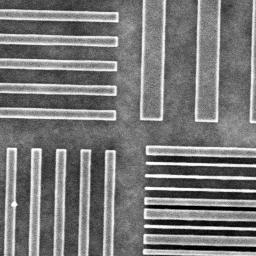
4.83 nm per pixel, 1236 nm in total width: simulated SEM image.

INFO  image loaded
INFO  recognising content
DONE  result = groups of lines, slits or small figures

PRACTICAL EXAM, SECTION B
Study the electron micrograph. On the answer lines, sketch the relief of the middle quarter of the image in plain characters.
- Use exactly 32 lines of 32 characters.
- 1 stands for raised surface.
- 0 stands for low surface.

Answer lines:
11111111111110000001111110000000
00000011111110000001111110000000
00000000000000000001111110000000
00000000000000000001111110000000
00000000000000000001111110000000
11100000000000000001111110000000
11111111111110000001111110000000
00000111111110000001111110000000
00000000000000000001111110000000
00000000000000000001111110000000
00000000000000000001111110000000
00000000000000000001111110000000
11111111111110000001111110000000
11111111111110000001111110000000
00000000000000000000000000000000
00000000000000000000000000000000
00000000000000000000000000000000
00000000000000000000000000000000
00000000000000000000000000000000
00000000000000000000000000000000
00000000000000000000000000000000
00000000000000000000011111111111
00001100001110000000011111111111
00001100001110000000000000000000
00001100001110000000000000000000
00001100001110000000000000000000
00001100001110000000000000000000
00001100001110000000000000000000
00001100001110000000000000000000
00001100001110000000000000000000
00001100001110000000000000000000
00001100001110000000000000000000